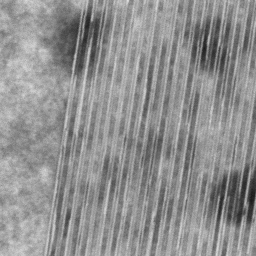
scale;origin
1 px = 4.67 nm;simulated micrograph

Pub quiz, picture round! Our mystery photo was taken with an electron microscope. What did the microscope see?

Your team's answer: parallel lines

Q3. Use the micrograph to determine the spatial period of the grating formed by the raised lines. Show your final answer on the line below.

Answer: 46.6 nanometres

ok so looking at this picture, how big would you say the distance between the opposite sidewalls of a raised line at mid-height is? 0.0231 micrometres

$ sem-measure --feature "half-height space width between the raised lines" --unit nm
23.7